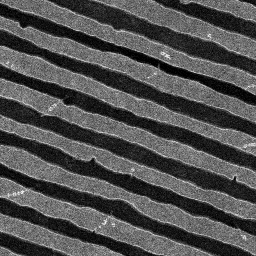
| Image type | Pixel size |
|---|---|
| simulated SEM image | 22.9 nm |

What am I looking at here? parallel lines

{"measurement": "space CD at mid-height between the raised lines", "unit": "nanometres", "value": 319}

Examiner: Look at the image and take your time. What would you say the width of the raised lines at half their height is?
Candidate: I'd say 394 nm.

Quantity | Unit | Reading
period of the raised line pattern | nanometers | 704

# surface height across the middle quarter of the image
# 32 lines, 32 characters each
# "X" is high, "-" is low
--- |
---------XXXXXXXXXXXXX-X---XXXXX
X-----------XXXXXXXXXXXX-------X
XXXX-----------XXXXXXXXXXX------
XXXXXXX----------XXXXXXXXXXXXX--
XXXXXXXXX----------XXXXXXXXXXXXX
XXXXXXXXXXX-----------XXXXXXXXXX
---XXXXXXXXXX-----------XXXXXXXX
-----XXXXXXXXXXX----------XXXXXX
--------XXXXXXXXXX------------XX
----------XXXXXXXXXXXX----------
XXX---------XXXXXXXXXXXXX-------
XXXXX----------XXXXXXXXXXX------
XXXXXXXX----------XXXXXXXXXXX---
XXXXXXXXXXX---------XXXXXXXXXXXX
-XXXXXXXXXXXXX----------XXXXXXXX
----XXXXXXXXXXXXX-----------XXXX
-------XXXXXXXXXXXXX-----------X
----------XXXXXXXXXXXX----------
X-------------XXXXXXXXXX--------
XXXX------------XXXXXXXXXXXXX---
XXXXXXX------------XXXXXXXXXXXX-
XXXXXXXXXXX-----------XXXXXXXXXX
-XXXXXXXXXXX------------XXXXXXXX
--XXXXXXXXXXXXX-----------XXXXXX
--------XXXXXXXXXX------------XX
----------XXXXXXXXXX------------
-----------XXXXXXXXXXXX---------
XXX-------------XXXXXXXXXX------
XXXXXXXX----------XXXXXXXXXX----
XXXXXXXXXXX----------XXXXXXXXXX-
XXXXXXXXXXXXX----------XXXXXXXXX
---XXXXXXXXXXXX------------XXXXX